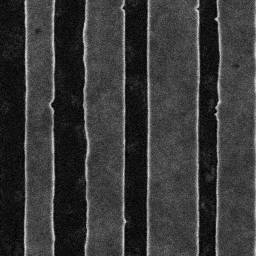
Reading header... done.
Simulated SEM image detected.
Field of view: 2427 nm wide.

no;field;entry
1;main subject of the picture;one or a few lines or trenches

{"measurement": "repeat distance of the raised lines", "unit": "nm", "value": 633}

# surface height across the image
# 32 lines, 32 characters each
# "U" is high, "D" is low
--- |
DDDUUUUDDDDUUUUDDDDUUUUUUDDUUUUU
DDDUUUUDDDDUUUUUDDDUUUUUUDDUUUUU
DDDUUUUDDDDUUUUUDDDUUUUUUDDUUUUU
DDDUUUUDDDDUUUUUDDDUUUUUUDDUUUUU
DDDUUUUDDDDUUUUUDDDUUUUUUDDUUUUU
DDDUUUUDDDDUUUUUDDDUUUUUUDDUUUUU
DDDUUUUDDDDUUUUUDDDUUUUUUDDDUUUU
DDDUUUUDDDDUUUUUDDDUUUUUUDDDUUUU
DDDUUUUDDDDUUUUUDDDUUUUUUDDUUUUU
DDDUUUUDDDDUUUUUDDDUUUUUUDDUUUUU
DDDUUUUDDDDUUUUDDDDUUUUUUDDUUUUU
DDDUUUUDDDUUUUUUDDDUUUUUUDDUUUUU
DDDUUUUDDDUUUUUUDDDUUUUUUDDUUUUU
DDDUUUDDDDUUUUUUDDDUUUUUUDDUUUUU
DDDUUUUDDDDUUUUUDDDUUUUUUDDUUUUU
DDDUUUUDDDDUUUUUDDDUUUUUUDDUUUUU
DDDUUUUDDDDUUUUUDDDUUUUUUDDUUUUU
DDDUUUUDDDDUUUUUDDDUUUUUUDDUUUUU
DDDUUUUDDDDUUUUUDDDUUUUUUDDUUUUU
DDDUUUUDDDDUUUUUDDDUUUUUUDDUUUUU
DDDUUUUDDDDUUUUUDDDUUUUUUDDUUUUU
DDDUUUUDDDDUUUUDDDDUUUUUUDDUUUUU
DDDUUUUDDDDUUUUDDDDUUUUUUDDUUUUU
DDDUUUUDDDDUUUUDDDUUUUUUUDDUUUUU
DDDUUUUDDDDUUUUDDDUUUUUUUDDUUUUU
DDDUUUUDDDDUUUUDDDUUUUUUUDDUUUUU
DDDUUUUDDDDUUUUDDDUUUUUUUDDUUUUU
DDDUUUUDDDDUUUUUDDUUUUUUUDDUUUUU
DDDUUUUDDDDUUUUUDDUUUUUUUDDUUUUU
DDDUUUUDDDDUUUUDDDUUUUUUUDDUUUUU
DDDUUUUDDDDUUUUDDDUUUUUUUDDUUUUU
DDDUUUUDDDDUUUUDDDUUUUUUUDDUUUUU